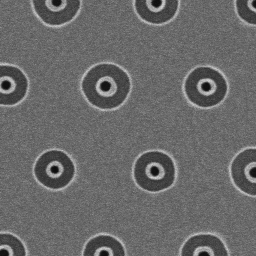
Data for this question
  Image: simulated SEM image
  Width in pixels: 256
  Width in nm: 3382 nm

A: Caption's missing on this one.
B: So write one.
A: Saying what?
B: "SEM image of ring-shaped grooves with a dot in the middle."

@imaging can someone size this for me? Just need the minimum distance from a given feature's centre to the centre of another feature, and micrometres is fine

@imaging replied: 1.3